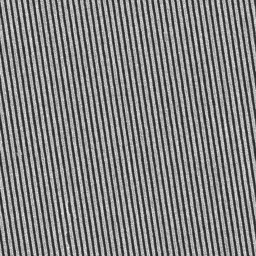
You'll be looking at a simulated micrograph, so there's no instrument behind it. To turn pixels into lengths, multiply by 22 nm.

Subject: parallel lines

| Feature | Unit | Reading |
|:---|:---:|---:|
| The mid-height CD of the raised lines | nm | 59.7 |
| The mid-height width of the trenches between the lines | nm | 57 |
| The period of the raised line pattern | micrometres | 0.123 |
